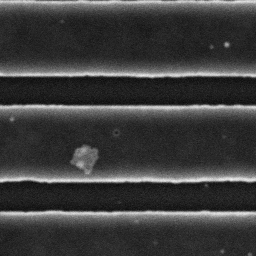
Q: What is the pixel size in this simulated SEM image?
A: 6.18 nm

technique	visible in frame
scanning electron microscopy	lines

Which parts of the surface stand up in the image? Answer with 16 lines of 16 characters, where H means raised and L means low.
HHHHHHHHHHHHHHHH
HHHHHHHHHHHHHHHH
HHHHHHHHHHHHHHHH
HHHHHHHHHHHHHHHH
HHHHHHHHHHHHHHHH
LLLLLLLLLLLLLLLL
LLLLLLLLLLLLLLLL
HHHHHHHHHHHHHHHH
HHHHHHHHHHHHHHHH
HHHHHHHHHHHHHHHH
HHHHHHHHHHHHHHHH
LLLLLLLLLLLLLLLL
LLLLLLLLLLLLLLLL
HHHHHHHHHHHHHHHH
HHHHHHHHHHHHHHHH
HHHHHHHHHHHHHHHH